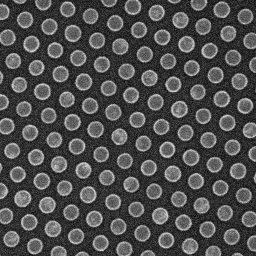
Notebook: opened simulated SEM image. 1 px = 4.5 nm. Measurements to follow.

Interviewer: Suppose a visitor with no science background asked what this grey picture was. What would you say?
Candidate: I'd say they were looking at a regular array of raised bodies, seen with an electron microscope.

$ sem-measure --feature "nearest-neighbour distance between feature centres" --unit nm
109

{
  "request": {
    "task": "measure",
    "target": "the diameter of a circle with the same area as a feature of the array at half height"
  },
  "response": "0.0683 micrometres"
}